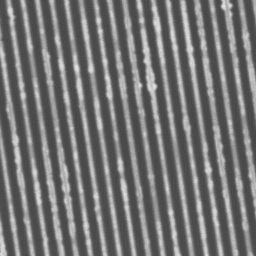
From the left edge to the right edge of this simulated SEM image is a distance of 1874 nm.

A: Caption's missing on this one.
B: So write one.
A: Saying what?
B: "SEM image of parallel lines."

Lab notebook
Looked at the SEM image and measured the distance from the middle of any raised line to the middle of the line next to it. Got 105 nm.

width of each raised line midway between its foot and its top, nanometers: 39.8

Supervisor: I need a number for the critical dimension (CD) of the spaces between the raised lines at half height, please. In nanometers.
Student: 66